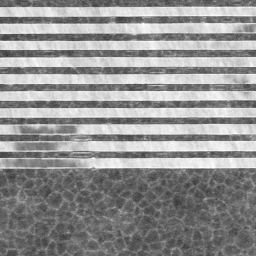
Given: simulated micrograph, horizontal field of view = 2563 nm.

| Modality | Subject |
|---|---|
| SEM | parallel lines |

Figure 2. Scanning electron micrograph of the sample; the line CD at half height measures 90.1 nanometers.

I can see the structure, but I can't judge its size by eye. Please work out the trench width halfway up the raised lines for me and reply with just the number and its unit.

75.1 nm